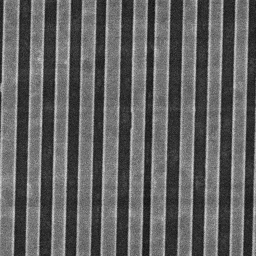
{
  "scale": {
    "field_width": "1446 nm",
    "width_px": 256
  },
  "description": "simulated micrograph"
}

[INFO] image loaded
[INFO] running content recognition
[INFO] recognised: parallel lines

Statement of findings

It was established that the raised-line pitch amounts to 144 nanometers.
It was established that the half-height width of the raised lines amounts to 73.5 nanometres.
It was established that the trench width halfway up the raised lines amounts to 73.5 nanometers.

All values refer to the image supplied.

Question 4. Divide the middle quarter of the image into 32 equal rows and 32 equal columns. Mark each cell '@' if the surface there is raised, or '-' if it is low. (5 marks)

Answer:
@---@@@----@@@---@@@---@@@----@@
@---@@@---@@@@---@@@---@@@----@@
@---@@@---@@@@---@@@---@@@----@@
@---@@@---@@@@---@@@---@@@----@@
@---@@@---@@@@---@@@---@@@----@@
@---@@@---@@@@---@@@---@@@----@@
@---@@@---@@@@---@@@---@@@----@@
@---@@@---@@@@---@@@---@@@----@@
@---@@@---@@@@---@@@---@@@---@@@
@---@@@---@@@@---@@@--@@@@---@@@
@---@@@---@@@@---@@@--@@@@---@@@
@---@@@---@@@@---@@@--@@@@---@@@
@---@@@---@@@----@@@--@@@@---@@@
@---@@@---@@@----@@@--@@@@---@@@
@---@@@---@@@----@@@--@@@@---@@@
@---@@@---@@@----@@@--@@@@---@@@
@---@@@---@@@----@@@--@@@@---@@@
@---@@@---@@@----@@@--@@@@---@@@
@---@@@---@@@----@@@--@@@@---@@@
@---@@@---@@@----@@@--@@@@---@@@
@---@@@---@@@----@@@--@@@----@@@
@---@@@---@@@----@@@--@@@----@@@
----@@@---@@@----@@@--@@@----@@@
----@@@---@@@----@@@--@@@----@@@
@---@@@---@@@----@@@--@@@----@@@
@---@@@---@@@----@@@--@@@----@@@
@---@@@---@@@----@@@--@@@----@@@
@---@@@---@@@----@@@--@@@----@@@
----@@@---@@@----@@@--@@@----@@@
----@@@---@@@----@@@--@@@----@@@
----@@@---@@@----@@@--@@@----@@@
----@@@---@@@----@@@--@@@----@@@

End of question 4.